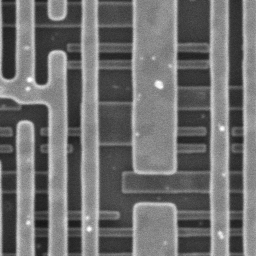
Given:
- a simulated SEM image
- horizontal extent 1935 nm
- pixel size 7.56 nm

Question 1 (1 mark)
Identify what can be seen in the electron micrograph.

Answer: wiring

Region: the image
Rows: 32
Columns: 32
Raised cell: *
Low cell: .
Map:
..**..**..**.....*****....**..**
..**..**..**.....*****....**..**
..**......**.....*****....**..**
..**......**.....*****....**..**
..**......**.....*****....**..**
..**......**.....*****....**...*
..**...*..**.....*****....**...*
..**..**..**.....*****....**..**
..**..**..**.....*****....**..**
..**..**..**.....*****....**..**
*****.**..**.....*****....**..**
********..**.....*****....**...*
..******..**.....*****....**...*
......**..**.....*****....**...*
......**..**.....*****....**...*
..**..**..**.....*****....**...*
..**..**..**.....*****....**...*
..**..**..**.....*****....**...*
..**..**..**.....*****....**...*
..**..**..**.....*****....**...*
..**..**..**.....*****....**..**
..**..**..**.....*****....**..**
..**..**..**..............***..*
..**..**..**..............***..*
..**..**..**..............***..*
..**..**..**.....*****....***..*
..**..**..**.....*****....***..*
..**..**..**.....*****....***.**
..**..**..**.....*****....***.**
..**..**..**.....*****....***.**
..**..**..**.....*****....**...*
..**..**..**.....*****....***..*